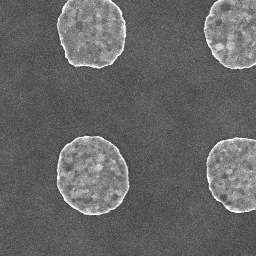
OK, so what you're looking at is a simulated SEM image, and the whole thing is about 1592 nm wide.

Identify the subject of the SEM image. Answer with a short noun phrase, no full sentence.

raised bodies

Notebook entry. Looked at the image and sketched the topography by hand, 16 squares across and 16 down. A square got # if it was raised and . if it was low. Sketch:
....###......###
....####.....###
....####.....###
....###......###
................
................
................
................
................
....###......###
....####.....###
....####.....###
....###.......##
................
................
................